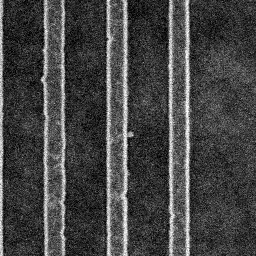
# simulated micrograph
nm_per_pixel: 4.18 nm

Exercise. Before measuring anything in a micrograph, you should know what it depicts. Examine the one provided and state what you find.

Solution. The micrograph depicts one or a few lines or trenches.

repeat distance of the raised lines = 261 nanometers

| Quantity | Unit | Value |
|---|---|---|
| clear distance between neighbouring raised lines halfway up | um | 0.185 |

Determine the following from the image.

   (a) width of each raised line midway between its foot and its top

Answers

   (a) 75.8 nm